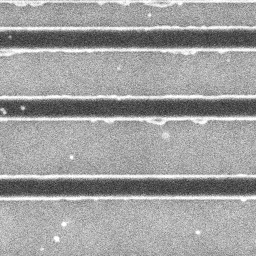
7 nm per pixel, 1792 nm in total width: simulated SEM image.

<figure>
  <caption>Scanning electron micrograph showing lines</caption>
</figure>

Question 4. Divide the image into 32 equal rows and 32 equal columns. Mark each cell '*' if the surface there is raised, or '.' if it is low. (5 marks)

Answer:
................................
................................
................................
********************************
********************************
********************************
*...............................
................................
................................
................................
................................
................................
********************************
********************************
********************************
................................
................................
................................
................................
................................
................................
................................
********************************
********************************
********************************
................................
................................
................................
................................
................................
................................
................................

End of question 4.